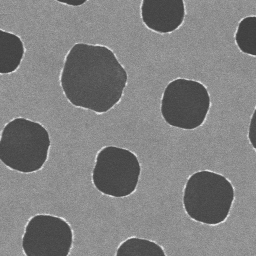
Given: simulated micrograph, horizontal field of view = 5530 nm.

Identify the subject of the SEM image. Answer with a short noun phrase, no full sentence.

holes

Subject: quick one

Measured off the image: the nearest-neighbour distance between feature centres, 2060 nm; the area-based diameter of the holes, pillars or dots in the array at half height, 1100 nm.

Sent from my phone